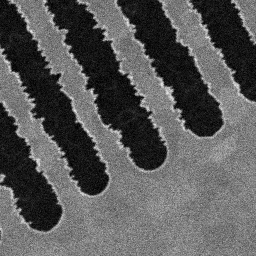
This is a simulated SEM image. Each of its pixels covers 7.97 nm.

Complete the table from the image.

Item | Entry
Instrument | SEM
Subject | one or a few lines or trenches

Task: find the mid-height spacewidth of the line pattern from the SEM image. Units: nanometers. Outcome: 298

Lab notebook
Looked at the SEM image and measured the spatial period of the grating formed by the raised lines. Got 0.486 um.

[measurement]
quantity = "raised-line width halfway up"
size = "23.9 px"